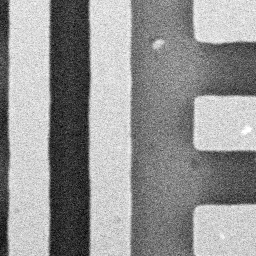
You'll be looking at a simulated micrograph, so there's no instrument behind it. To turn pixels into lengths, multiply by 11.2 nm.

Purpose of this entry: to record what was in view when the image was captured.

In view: groups of lines, slits or small figures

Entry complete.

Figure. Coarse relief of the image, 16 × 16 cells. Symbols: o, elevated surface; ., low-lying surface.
.oo...oo....oooo
.oo...oo....oooo
.oo...oo.....ooo
.oo...oo........
.oo...oo........
.oo...oo........
.oo...oo....oooo
.oo...oo....oooo
.oo...oo....oooo
.oo...oo........
.oo...oo........
.oo...oo........
.oo...oo........
.oo...oo....oooo
.oo...oo....oooo
.oo...oo....oooo